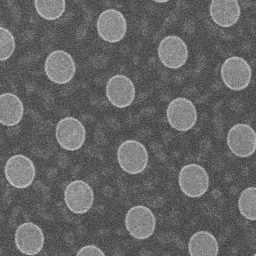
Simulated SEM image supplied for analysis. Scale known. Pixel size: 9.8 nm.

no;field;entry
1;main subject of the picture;a regular array of raised bodies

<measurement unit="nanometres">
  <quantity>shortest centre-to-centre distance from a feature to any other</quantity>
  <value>638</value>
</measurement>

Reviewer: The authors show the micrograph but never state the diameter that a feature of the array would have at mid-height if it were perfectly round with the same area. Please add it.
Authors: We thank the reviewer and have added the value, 297 nanometers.